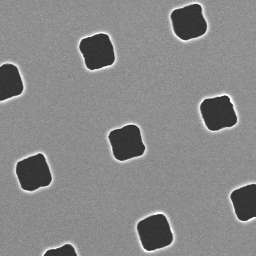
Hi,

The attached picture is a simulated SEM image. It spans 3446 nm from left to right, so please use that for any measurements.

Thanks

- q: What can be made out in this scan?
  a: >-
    holes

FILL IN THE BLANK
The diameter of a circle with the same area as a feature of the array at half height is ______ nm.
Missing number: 474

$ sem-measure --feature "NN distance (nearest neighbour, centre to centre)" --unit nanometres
1290